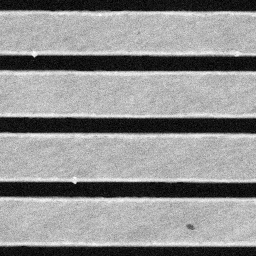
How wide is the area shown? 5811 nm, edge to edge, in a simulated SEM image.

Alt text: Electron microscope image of lines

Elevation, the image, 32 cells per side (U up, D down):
DDDDDDDDDDDDDDDDDDDDDDDDDDDDDDDD
UUUUUUUUUUUUUUUUUUUUUUUUUUUUUUUU
UUUUUUUUUUUUUUUUUUUUUUUUUUUUUUUU
UUUUUUUUUUUUUUUUUUUUUUUUUUUUUUUU
UUUUUUUUUUUUUUUUUUUUUUUUUUUUUUUU
UUUUUUUUUUUUUUUUUUUUUUUUUUUUUUUU
UUUUUUUUUUUUUUUUUUUUUUUUUUUUUUUU
DDDDDDDDDDDDDDDDDDDDDDDDDDDDDDDD
DDDDDDDDDDDDDDDDDDDDDDDDDDDDDDDD
UUUUUUUUUUUUUUUUUUUUUUUUUUUUUUUU
UUUUUUUUUUUUUUUUUUUUUUUUUUUUUUUU
UUUUUUUUUUUUUUUUUUUUUUUUUUUUUUUU
UUUUUUUUUUUUUUUUUUUUUUUUUUUUUUUU
UUUUUUUUUUUUUUUUUUUUUUUUUUUUUUUU
UUUUUUUUUUUUUUUUUUUUUUUUUUUUUUUU
DDDDDDDDDDDDDDDDDDDDDDDDDDDDDDDD
DDDDDDDDDDDDDDDDDDDDDDDDDDDDDDDD
UUUUUUUUUUUUUUUUUUUUUUUUUUUUUUUU
UUUUUUUUUUUUUUUUUUUUUUUUUUUUUUUU
UUUUUUUUUUUUUUUUUUUUUUUUUUUUUUUU
UUUUUUUUUUUUUUUUUUUUUUUUUUUUUUUU
UUUUUUUUUUUUUUUUUUUUUUUUUUUUUUUU
UUUUUUUUUUUUUUUUUUUUUUUUUUUUUUUU
DDDDDDDDDDDDDDDDDDDDDDDDDDDDDDDD
DDDDDDDDDDDDDDDDDDDDDDDDDDDDDDDD
UUUUUUUUUUUUUUUUUUUUUUUUUUUUUUUU
UUUUUUUUUUUUUUUUUUUUUUUUUUUUUUUU
UUUUUUUUUUUUUUUUUUUUUUUUUUUUUUUU
UUUUUUUUUUUUUUUUUUUUUUUUUUUUUUUU
UUUUUUUUUUUUUUUUUUUUUUUUUUUUUUUU
UUUUUUUUUUUUUUUUUUUUUUUUUUUUUUUU
DDDDDDDDDDDDDDDDDDDDDDDDDDDDDDDD